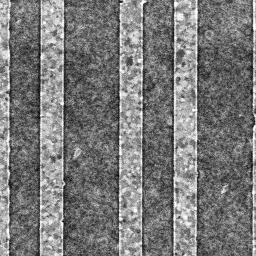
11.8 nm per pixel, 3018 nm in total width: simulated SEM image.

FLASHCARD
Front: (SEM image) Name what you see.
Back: one or a few lines or trenches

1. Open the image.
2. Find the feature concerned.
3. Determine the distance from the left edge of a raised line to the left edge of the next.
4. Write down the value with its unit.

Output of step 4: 66.8 pixels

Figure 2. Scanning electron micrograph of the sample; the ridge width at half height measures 249 nm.